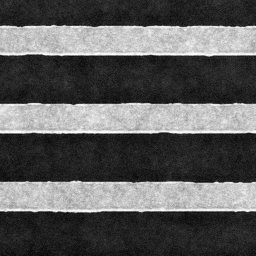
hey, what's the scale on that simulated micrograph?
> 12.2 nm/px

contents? lines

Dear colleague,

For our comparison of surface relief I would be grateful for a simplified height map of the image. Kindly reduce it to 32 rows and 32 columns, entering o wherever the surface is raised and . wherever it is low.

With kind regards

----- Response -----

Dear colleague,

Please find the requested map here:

................................
................................
................................
oooooooooooooooooooooooooooooooo
oooooooooooooooooooooooooooooooo
oooooooooooooooooooooooooooooooo
oooooooooooooooooooooooooooooooo
................................
................................
................................
................................
................................
................................
oooooooooooooooooooooooooooooooo
oooooooooooooooooooooooooooooooo
oooooooooooooooooooooooooooooooo
oooooooooo.ooooooooo.ooooooooooo
................................
................................
................................
................................
................................
................................
oooooooooooooooooooooooooooooooo
oooooooooooooooooooooooooooooooo
oooooooooooooooooooooooooooooooo
................................
................................
................................
................................
................................
................................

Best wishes